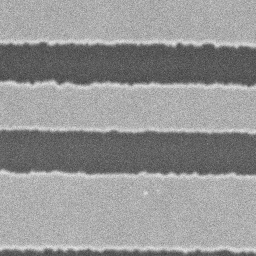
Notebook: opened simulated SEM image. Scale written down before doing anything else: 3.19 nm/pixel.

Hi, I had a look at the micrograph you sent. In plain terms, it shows lines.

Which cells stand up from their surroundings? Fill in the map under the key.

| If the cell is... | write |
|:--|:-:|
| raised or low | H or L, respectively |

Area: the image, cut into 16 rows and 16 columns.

HHHHHHHHHHHHHHHH
HHHHHHHHHHHHHHHH
HHHHHHHHHHHHHHHH
LLLLLLLLLLLLLLLL
LLLLLLLLLLLLLLLL
HHHHHHHHHHHHHHHH
HHHHHHHHHHHHHHHH
HHHHHHHHHHHHHHHH
LLLLLLLLLLLLLLLL
LLLLLLLLLLLLLLLL
LLLLLLLLLLLLLLLL
HHHHHHHHHHHHHHHH
HHHHHHHHHHHHHHHH
HHHHHHHHHHHHHHHH
HHHHHHHHHHHHHHHH
HHHHHHHHHHHHHHHH